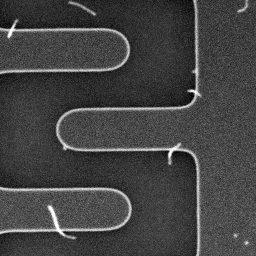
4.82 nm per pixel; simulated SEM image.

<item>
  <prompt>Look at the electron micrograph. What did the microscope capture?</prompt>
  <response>groups of lines, slits or small figures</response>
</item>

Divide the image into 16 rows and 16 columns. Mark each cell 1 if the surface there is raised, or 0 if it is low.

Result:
0000000000001111
0000000000001111
1111111100001111
1111111100001111
1000000000001111
0000000000001111
0000000000001111
0000111111111111
0000111111111111
0000000000001111
0000000000001111
0000000000001111
1111111100001111
1111111100001111
1000000000001111
0000000000001111